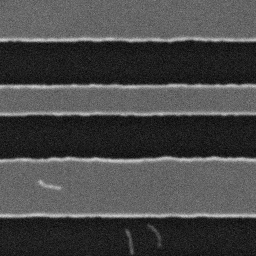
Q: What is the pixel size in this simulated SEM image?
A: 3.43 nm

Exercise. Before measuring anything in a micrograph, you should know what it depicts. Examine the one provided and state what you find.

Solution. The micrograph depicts lines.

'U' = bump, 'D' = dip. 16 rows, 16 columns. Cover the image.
UUUUUUUUUUUUUUUU
UUUUUUUUUUUUUUUU
UUUUUUUUUUUDUUUU
DDDDDDDDDDDDDDDD
DDDDDDDDDDDDDDDD
UUUUUUUUUUUUUUUU
UUUUUUUUUUUUUUUU
DDDDDDDDDDDDDDDD
DDDDDDDDDDDDDDDD
DDDDDDDDDDDDDDDD
UUUUUUUUUUUUUUUU
UUUUUUUUUUUUUUUU
UUUUUUUUUUUUUUUU
UUDUUUUUUUUUUUUU
DDDDDDDDDDDDDDDD
DDDDDDDDDDDDDDDD